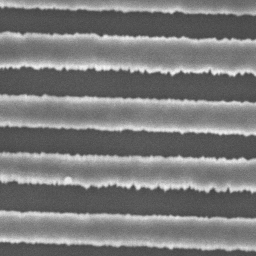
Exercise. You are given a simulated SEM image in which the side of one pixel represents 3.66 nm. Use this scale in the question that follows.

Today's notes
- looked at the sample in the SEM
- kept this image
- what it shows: lines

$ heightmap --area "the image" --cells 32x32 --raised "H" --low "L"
HHHHHHHHHHHHHHHHHHHHHHHHHHHHHHHH
LLLLLLLLLLLLLLLLLLLLHHLHHHHHHHHH
LLLLLLLLLLLLLLLLLLLLLLLLLLLLLLLL
LLLLLLLLLLLLLLLLLLLLLLLLLLLLLLLL
HHHHHHHHHHHHHHHLLLLLLLLLLLLLLLLL
HHHHHHHHHHHHHHHHHHHHHHHHHHHHHHHH
HHHHHHHHHHHHHHHHHHHHHHHHHHHHHHHH
HHHHHHHHHHHHHHHHHHHHHHHHHHHHHHHH
HLLLHLLHHHHHHHHHHHHHHHHHHHHHHHHH
LLLLLLLLLLLLLLLLLLLLLLLLLLLLLLLL
LLLLLLLLLLLLLLLLLLLLLLLLLLLLLLLL
LLLLLLLLLLLLLLLLLLLLLLLLLLLLLLLL
HHHHHHHHHHHHHHHHHHHHHHLHLLLLLLLL
HHHHHHHHHHHHHHHHHHHHHHHHHHHHHHHH
HHHHHHHHHHHHHHHHHHHHHHHHHHHHHHHH
HHHHHHHHHHHHHHHHHHHHHHHHHHHHHHHH
LLLLLLLLLLLLLLLLLLLLLLHHHHHHHHHH
LLLLLLLLLLLLLLLLLLLLLLLLLLLLLLLL
LLLLLLLLLLLLLLLLLLLLLLLLLLLLLLLL
HHHHHHHHHHHHLHLLLLLLLLLLLLLLLLLL
HHHHHHHHHHHHHHHHHHHHHHHHHHHHHHHH
HHHHHHHHHHHHHHHHHHHHHHHHHHHHHHHH
HHHHHHHHHHHHHHHHHHHHHHHHHHHHHHHH
LLLLLLLLLLLLLLLLLHHLHHHHHHHHHHHH
LLLLLLLLLLLLLLLLLLLLLLLLLLLLLLLL
LLLLLLLLLLLLLLLLLLLLLLLLLLLLLLLL
HHLHLLLLLLLLLLLLLLLLLLLLLLLLLLLL
HHHHHHHHHHHHHHHHHHHHHHHHHHHHHHHH
HHHHHHHHHHHHHHHHHHHHHHHHHHHHHHHH
HHHHHHHHHHHHHHHHHHHHHHHHHHHHHHHH
LLLLLLLLHHHHHHHHHHHHHHHHHHHHHHHH
LLLLLLLLLLLLLLLLLLLLLLLLLLLLLLLL